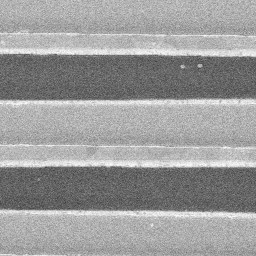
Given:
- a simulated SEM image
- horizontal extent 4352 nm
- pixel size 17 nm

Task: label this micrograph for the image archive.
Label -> lines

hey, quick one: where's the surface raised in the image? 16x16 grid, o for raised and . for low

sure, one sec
oooooooooooooooo
oooooooooooooooo
oooooooooooooooo
................
................
................
oooooooooooooooo
oooooooooooooooo
oooooooooooooooo
oooooooooooooooo
................
................
................
ooooooooooooo...
oooooooooooooooo
oooooooooooooooo